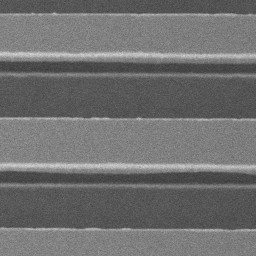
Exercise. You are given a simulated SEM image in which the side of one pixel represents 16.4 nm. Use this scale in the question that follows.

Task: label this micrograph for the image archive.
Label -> lines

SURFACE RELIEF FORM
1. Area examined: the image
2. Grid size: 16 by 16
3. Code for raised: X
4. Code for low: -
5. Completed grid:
----------------
XXXXXXXXXXXXXXXX
XXXXXXXXXXXXXXXX
---XXXXXXXXXXXXX
----------------
----------------
----------------
XXXXXXXXXXXXXXXX
XXXXXXXXXXXXXXXX
XXXXXXXXXXXXXXXX
-------XXXXXXXXX
----------------
----------------
----------------
XXXXXXXXXXXXXXXX
XXXXXXXXXXXXXXXX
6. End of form